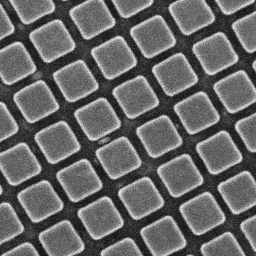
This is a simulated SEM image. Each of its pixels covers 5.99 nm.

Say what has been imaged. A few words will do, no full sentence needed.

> a regular array of raised bodies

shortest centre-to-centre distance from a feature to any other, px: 44.2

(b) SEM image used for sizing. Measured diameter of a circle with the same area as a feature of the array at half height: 231 nanometres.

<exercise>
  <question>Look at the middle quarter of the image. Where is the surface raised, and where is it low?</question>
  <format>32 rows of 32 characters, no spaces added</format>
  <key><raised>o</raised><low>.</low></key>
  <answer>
.ooooo...oooooooo......oooooooo.
oooooo...ooooooo......oooooooooo
ooooooo...oooo.........ooooooooo
ooooooo....o......oo...ooooooooo
oooooooo........ooooo...oooooooo
oooooooo......ooooooo....oooooo.
oooooooo.....ooooooooo...ooooo..
oooooo......ooooooooooo...oo....
oooo.........oooooooooo........o
.......oooo...oooooooooo.....ooo
.....ooooooo..ooooooooo.....oooo
....oooooooo...oooooo.......oooo
...oooooooooo..oooo.........oooo
...oooooooooo..........ooo...ooo
....oooooooooo........ooooo...oo
o...oooooooooo......ooooooo...oo
oo...oooooooo.....oooooooooo...o
oo....oooo........ooooooooooo...
ooo...ooo.....o....oooooooooo...
ooo......o..oooo....ooooooooo...
oooo......ooooooo...oooooooo....
ooo.....oooooooooo...oooooo.....
oo......oooooooooo....ooo.......
.........oooooooooo.........ooo.
....oo...oooooooooo.......oooooo
..ooooo...ooooooooo.....oooooooo
ooooooo...ooooooo.......oooooooo
oooooooo...oooo.........oooooooo
ooooooooo...o.......o...oooooooo
ooooooooo.........oooo...ooooooo
ooooooooo.......ooooooo...oooooo
oooooooo......ooooooooo...ooooo.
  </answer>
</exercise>